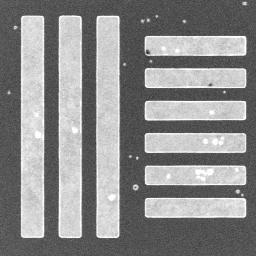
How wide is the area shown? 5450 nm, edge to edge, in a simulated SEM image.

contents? groups of lines, slits or small figures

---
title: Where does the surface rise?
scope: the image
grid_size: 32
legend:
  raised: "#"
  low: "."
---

................................
................................
...##..###..###.................
...##..###..###.................
...##..###..###.................
...##..###..###...#############.
...##..###..###...#############.
...##..###..###.................
...##..###..###.................
...##..###..###...#############.
...##..###..###...#############.
...##..###..###.................
...##..###..###.................
...##..###..###...#############.
...##..###..###...#############.
...##..###..###.................
...##..###..###.................
...##..###..###...#############.
...##..###..###...#############.
...##..###..###.................
...##..###..###.................
...##..###..###...#############.
...##...##..###...#############.
...##...##..###.................
...##...##..###.................
...##...##..###...#############.
...##..###..###...#############.
...##..###..###.................
...##..###..###.................
...##...##..###.................
................................
................................